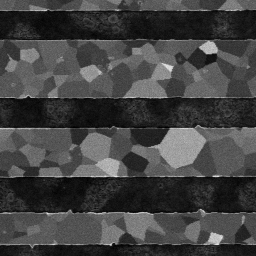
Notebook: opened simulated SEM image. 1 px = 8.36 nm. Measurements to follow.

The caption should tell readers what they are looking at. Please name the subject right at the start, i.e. one or a few lines or trenches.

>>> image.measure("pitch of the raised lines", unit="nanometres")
668